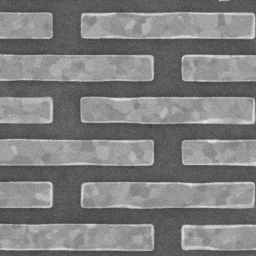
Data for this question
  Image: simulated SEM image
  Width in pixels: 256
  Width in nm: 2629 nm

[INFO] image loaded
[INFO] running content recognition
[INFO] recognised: groups of lines, slits or small figures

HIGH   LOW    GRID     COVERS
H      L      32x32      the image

LLLLLLLLLLLLLLLLLLLLLLLLLLLLLLLL
LLLLLLLLLLLLLLLLLLLLLLLLLLLLLLLL
HHHHHHLLLLHHHHHHHHHHHHHHHHHHHHHH
HHHHHHLLLLHHHHHHHHHHHHHHHHHHHHHH
HHHHHHLLLLHHHHHHHHHHHHHHHHHHHHHL
LLLLLLLLLLLLLLLLLLLLLLLLLLLLLLLL
LLLLLLLLLLLLLLLLLLLLLLLLLLLLLLLL
HHHHHHHHHHHHHHHHHHHLLLLHHHHHHHHH
HHHHHHHHHHHHHHHHHHHLLLLHHHHHHHHH
HHHHHHHHHHHHHHHHHHHLLLLHHHHHHHHH
LLLLLLLLLLLLLLLLLLLLLLLLLLLLLLLL
LLLLLLLLLLLLLLLLLLLLLLLLLLLLLLLL
LLLLHHLLLLHHHHHHHHHHHHHHHHHHHHHH
HHHHHHLLLLHHHHHHHHHHHHHHHHHHHHHH
HHHHHHLLLLHHHHHHHHHHHHHHHHHHHHHH
LLLLLLLLLLLLLLLLLLLLLLLLLLLLLLLL
LLLLLLLLLLLLLLLLLLLLLLLLLLLLLLLL
HHHHLLLLLLLLLLLLLLLLLLLLLLLLLLLL
HHHHHHHHHHHHHHHHHHHLLLLHHHHHHHHH
HHHHHHHHHHHHHHHHHHHLLLLHHHHHHHHH
HHHHHHHHLLLLHHHHHHHLLLLHLLLLLLLL
LLLLLLLLLLLLLLLLLLLLLLLLLLLLLLLL
LLLLLLLLLLLLLLLLLLLLLLLLLLLLLLLL
HHHHHHLLLLHHHHHHHHHHHHHHHHHHHHHH
HHHHHHLLLLHHHHHHHHHHHHHHHHHHHHHH
HHHHHHLLLLHHHHHHHHHHHHHHHHHHHHHL
LLLLLLLLLLLLLLLLLLLLLLLLLLLLLLLL
LLLLLLLLLLLLLLLLLLLLLLLLLLLLLLLL
HHHHHHHHHHHHHHHHHHHLLLLHHHHHHHHH
HHHHHHHHHHHHHHHHHHHLLLLHHHHHHHHH
HHHHHHHHHHHHHHHHHHHLLLLHHHHHHHHH
LLLLLLLLLLLLLLLLLLLLLLLLLLLLLLLL